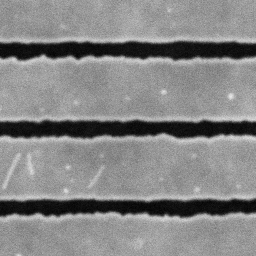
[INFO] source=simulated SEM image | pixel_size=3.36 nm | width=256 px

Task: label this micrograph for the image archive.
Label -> lines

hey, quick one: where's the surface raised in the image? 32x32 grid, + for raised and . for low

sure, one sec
++++++++++++++++++++++++++++++++
++++++++++++++++++++++++++++++++
++++++++++++++++++++++++++++++++
++++++++++++++++++++++++++++++++
++++++++++++++++++++++++++++++++
................................
................................
++..++++++++++++++++++.+++++++++
++++++++++++++++++++++++++++++++
++++++++++++++++++++++++++++++++
++++++++++++++++++++++++++++++++
++++++++++++++++++++++++++++++++
++++++++++++++++++++++++++++++++
++++++++++++++++++++++++++++++++
++++++++++++++++++++++++++++++++
................................
................................
++++++++++++++++++++++++++++++++
++++++++++++++++++++++++++++++++
++++++++++++++++++++++++++++++++
++++++++++++++++++++++++++++++++
++++++++++++++++++++++++++++++++
++++++++++++++++++++++++++++++++
++++++++++++++++++++++++++++++++
++++++++++++++++++++++++++++++++
................................
................................
++++++++++++++++++++++++++++++++
++++++++++++++++++++++++++++++++
++++++++++++++++++++++++++++++++
++++++++++++++++++++++++++++++++
++++++++++++++++++++++++++++++++